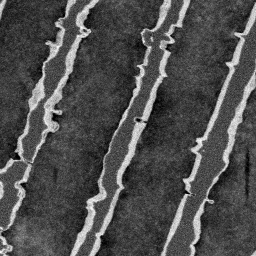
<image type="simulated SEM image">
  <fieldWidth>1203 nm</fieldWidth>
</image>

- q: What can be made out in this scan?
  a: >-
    one or a few lines or trenches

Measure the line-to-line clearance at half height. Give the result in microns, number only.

0.309